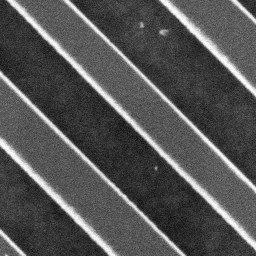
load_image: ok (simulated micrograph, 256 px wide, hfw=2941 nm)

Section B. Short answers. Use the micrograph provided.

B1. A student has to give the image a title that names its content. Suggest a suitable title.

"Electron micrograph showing lines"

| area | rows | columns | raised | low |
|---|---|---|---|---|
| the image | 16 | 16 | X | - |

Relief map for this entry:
-XXXX------XXXX-
--XXXX------XXXX
---XXXX------XXX
----XXXX------XX
-----XXXX------X
X-----XXXX------
XX-----XXXX-----
XXX-----XXXX----
XXXX-----XXXX---
XXXXX-----XXXX--
-XXXXX-----XXXX-
--XXXXX-----XXXX
---XXXXX-----XXX
----XXXXX-----XX
-----XXXXX-----X
X-----XXXXX-----